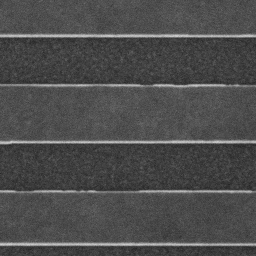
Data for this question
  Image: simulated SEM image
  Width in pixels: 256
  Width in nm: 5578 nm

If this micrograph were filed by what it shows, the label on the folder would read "lines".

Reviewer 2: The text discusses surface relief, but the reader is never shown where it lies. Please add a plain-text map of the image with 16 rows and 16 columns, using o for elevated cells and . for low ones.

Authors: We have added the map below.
oooooooooooooooo
oooooooooooooooo
................
................
................
oooooooooooooooo
oooooooooooooooo
oooooooooooooooo
oooooooooooooooo
................
................
................
oooooooooooooooo
oooooooooooooooo
oooooooooooooooo
................